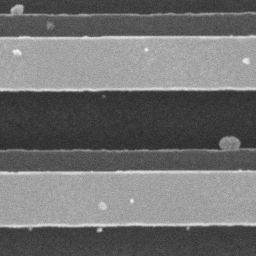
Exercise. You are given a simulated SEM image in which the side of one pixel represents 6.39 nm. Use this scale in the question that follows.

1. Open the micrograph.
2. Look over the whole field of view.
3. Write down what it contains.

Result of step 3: lines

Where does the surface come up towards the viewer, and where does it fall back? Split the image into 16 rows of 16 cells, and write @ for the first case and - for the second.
----------------
@@@@@@@@@@@@@@@@
@@@@@@@@@@@@@@@@
@@@@@@@@@@@@@@@@
@@@@@@@@@@@@@@@@
@@@@@@@@@@@@@@@@
----------------
----------------
----------------
@@@@@@@@@@@@@@@@
@@@@@@@@@@@@@@@@
@@@@@@@@@@@@@@@@
@@@@@@@@@@@@@@@@
@@@@@@@@@@@@@@@@
----------------
----------------